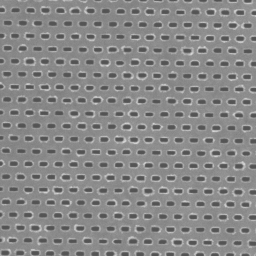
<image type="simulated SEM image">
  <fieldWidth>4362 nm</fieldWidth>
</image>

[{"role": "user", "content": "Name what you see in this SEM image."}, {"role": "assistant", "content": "a regular array of holes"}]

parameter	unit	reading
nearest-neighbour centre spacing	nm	247